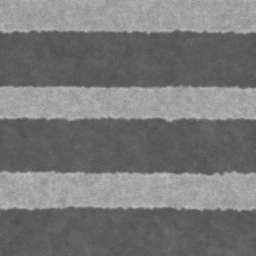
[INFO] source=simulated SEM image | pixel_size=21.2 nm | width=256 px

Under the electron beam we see one or a few lines or trenches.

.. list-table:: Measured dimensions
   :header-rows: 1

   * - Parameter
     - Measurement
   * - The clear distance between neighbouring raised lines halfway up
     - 1200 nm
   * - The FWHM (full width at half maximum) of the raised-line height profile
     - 659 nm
